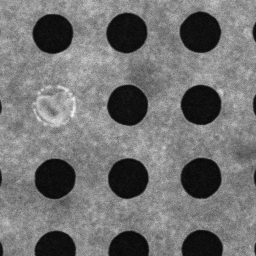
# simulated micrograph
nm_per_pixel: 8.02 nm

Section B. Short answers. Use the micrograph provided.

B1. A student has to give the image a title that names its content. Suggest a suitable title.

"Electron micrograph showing a regular array of holes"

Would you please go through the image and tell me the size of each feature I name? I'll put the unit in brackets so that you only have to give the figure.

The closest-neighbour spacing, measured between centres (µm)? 0.584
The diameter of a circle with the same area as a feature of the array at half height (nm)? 328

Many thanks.